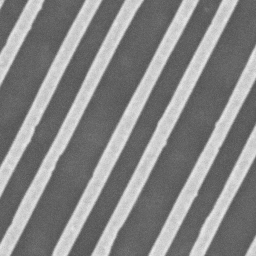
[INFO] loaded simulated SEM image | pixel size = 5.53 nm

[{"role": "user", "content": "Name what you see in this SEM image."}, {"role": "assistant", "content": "parallel lines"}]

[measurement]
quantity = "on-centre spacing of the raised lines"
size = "237 nanometres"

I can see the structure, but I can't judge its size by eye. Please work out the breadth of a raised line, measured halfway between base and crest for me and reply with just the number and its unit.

12.5 px